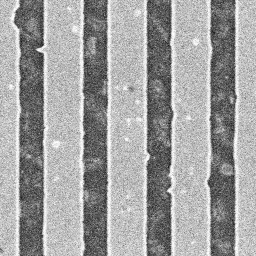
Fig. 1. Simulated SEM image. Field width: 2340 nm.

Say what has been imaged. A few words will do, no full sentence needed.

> one or a few lines or trenches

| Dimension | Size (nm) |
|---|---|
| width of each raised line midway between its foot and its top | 334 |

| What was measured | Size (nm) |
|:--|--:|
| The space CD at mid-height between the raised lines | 248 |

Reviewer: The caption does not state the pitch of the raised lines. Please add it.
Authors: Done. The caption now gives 583 nanometres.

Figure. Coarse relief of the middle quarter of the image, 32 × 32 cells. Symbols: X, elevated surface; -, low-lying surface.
XXXX-------XXXXXXXXX-------XXXXX
XXXXX------XXXXXXXXX-------XXXXX
XXXXX------XXXXXXXXX-------XXXXX
XXXX-------XXXXXXXXX-------XXXXX
XXXX-------XXXXXXXXX-------XXXXX
XXXX-------XXXXXXXXX-------XXXXX
XXXX-------XXXXXXXXX-------XXXXX
XXXX-------XXXXXXXXX-------XXXXX
XXXXX------XXXXXXXXX-------XXXXX
XXXXX------XXXXXXXXX-------XXXXX
XXXX-------XXXXXXXXX-------XXXXX
XXXX-------XXXXXXXXX-------XXXXX
XXXX-------XXXXXXXXX--------XXXX
XXXX-------XXXXXXXXX--------XXXX
XXXX-------XXXXXXXXX-------XXXXX
XXXX-------XXXXXXXXX-------XXXXX
XXXXX------XXXXXXXXX-------XXXXX
XXXXX------XXXXXXXXX-------XXXXX
XXXX-------XXXXXXXXX-------XXXXX
XXXXX------XXXXXXXXX-------XXXXX
XXXXX------XXXXXXXXX-------XXXXX
XXXXX------XXXXXXXXX-------XXXXX
XXXX-------XXXXXXXXXX------XXXXX
XXXX-------XXXXXXXXXX------XXXXX
XXXX-------XXXXXXXXX-------XXXXX
XXXX-------XXXXXXXXX-------XXXXX
XXXXX------XXXXXXXXX-------XXXXX
XXXXX------XXXXXXXXX-------XXXXX
XXXXX------XXXXXXXXX-------XXXXX
XXXXX------XXXXXXXXX-------XXXXX
XXXX-------XXXXXXXXX-------XXXXX
XXXXX------XXXXXXXXX------XXXXXX